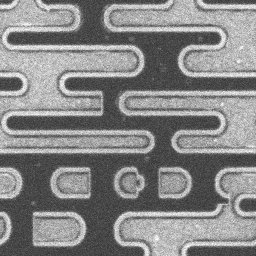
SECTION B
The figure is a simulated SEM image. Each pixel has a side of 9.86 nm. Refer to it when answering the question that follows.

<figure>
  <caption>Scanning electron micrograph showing parallel lines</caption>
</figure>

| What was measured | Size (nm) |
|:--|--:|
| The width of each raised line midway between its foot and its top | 192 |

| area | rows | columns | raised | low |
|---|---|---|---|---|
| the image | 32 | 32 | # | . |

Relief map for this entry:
##...################....#######
.........#####..................
..........###...................
.........#####..................
.###########################....
.###########################....
.................######.........
..................#####.........
.................######.........
###.....########################
###.....########################
###.....########################
.............##.................
.............###................
.###########################....
############################....
.##########################.....
...................###..........
...................###..........
################################
################################
..######...####..###...#####....
..#####....####...##....###.....
..#####....####..###...####.....
.########..#########..######....
############################..##
###########################...##
.###......#####.................
.###......#####.................
.###......#####.................
#######.#########.......#####.##
##################.....#########